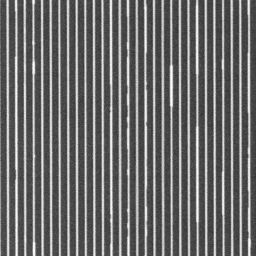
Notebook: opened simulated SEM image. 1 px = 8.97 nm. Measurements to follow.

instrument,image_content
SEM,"parallel lines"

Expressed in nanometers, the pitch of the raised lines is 77.4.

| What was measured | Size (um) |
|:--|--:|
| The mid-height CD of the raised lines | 0.0112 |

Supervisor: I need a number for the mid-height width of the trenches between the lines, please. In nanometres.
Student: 62.8